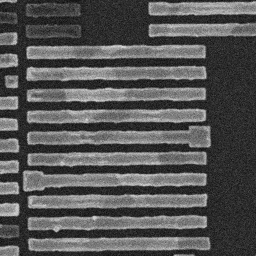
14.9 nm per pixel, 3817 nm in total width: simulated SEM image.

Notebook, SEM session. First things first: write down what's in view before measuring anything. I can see wiring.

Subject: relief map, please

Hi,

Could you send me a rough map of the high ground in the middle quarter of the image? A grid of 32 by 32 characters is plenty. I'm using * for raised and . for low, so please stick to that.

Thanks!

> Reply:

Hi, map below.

................................
********************************
********************************
********************************
................................
................................
******..************************
********************************
********************************
................................
................................
..........................**....
********************************
********************************
................................
................................
...............................*
********************************
****..**************************
*************************.**.***
................................
................................
.********.**********************
********************************
********************************
................................
................................
................................
********************************
********************************
................................
................................